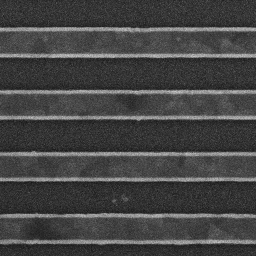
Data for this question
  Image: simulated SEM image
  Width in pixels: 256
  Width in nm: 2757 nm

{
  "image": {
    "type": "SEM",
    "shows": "one or a few lines or trenches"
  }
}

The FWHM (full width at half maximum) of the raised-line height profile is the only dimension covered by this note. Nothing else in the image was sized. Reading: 279 nanometres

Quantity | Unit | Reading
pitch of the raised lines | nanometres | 668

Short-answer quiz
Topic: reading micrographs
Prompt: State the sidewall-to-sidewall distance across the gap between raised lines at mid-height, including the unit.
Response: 390 nanometers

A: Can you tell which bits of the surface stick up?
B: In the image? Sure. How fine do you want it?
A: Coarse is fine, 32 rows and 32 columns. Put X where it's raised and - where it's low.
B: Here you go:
--------------------------------
--------------------------------
--------------------------------
--------------------------------
XXXXXXXXXXXXXXXXXXXXXXXXXXXXXXXX
XXXXXXXXXXXXXXXXXXXXXXXXXXXXXXXX
XXXXXXXXXXXXXXXXXXXXXXXXXXXXXXXX
--------------------------------
--------------------------------
--------------------------------
--------------------------------
--------------------------------
XXXXXXXXXXXXXXXXXXXXXXXXXXXXXXXX
XXXXXXXXXXXXXXXXXXXXXXXXXXXXXXXX
XXXXXXXXXXXXXXXXXXXXXXXXXXXXXXXX
--------------------------------
--------------------------------
--------------------------------
--------------------------------
XXXXXXXXXXXXXXXXXXXXXXXXXXXXXXXX
XXXXXXXXXXXXXXXXXXXXXXXXXXXXXXXX
XXXXXXXXXXXXXXXXXXXXXXXXXXXXXXXX
--------------------------------
--------------------------------
--------------------------------
--------------------------------
--------------------------------
XXXXXXXXXXXXXXXXXXXXXXXXXXXXXXXX
XXXXXXXXXXXXXXXXXXXXXXXXXXXXXXXX
XXXXXXXXXXXXXXXXXXXXXXXXXXXXXXXX
--------------------------------
--------------------------------